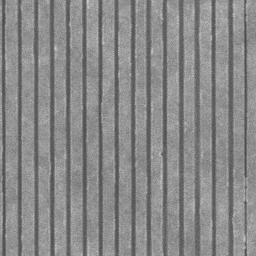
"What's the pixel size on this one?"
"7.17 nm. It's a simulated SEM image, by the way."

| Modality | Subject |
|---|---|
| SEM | parallel lines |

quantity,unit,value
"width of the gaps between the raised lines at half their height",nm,35.9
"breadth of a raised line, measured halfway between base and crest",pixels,11.4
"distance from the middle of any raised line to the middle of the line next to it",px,16.2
